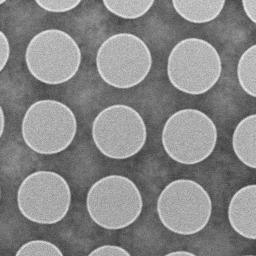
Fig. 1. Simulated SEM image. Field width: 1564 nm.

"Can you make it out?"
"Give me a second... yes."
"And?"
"an array of small figures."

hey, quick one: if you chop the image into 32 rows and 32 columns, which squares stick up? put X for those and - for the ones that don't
-----XXXXX---XXXXXX---XXXXXX--XX
--------------XXXX----XXXXX----X
------------------------XX------
--------------------------------
X----XXXX-----XXX---------------
X---XXXXX----XXXXX----XXXX------
X--XXXXXXX--XXXXXXX---XXXXX----X
X--XXXXXXX--XXXXXXX--XXXXXX---XX
----XXXXXX--XXXXXXX--XXXXXXX--XX
----XXXXX----XXXXX---XXXXXX---XX
--------------XXX-----XXXXX---XX
-----------------------XX------X
--------------------------------
----XXXX------XX----------------
---XXXXXX---XXXXX-----XXXX-----X
---XXXXXX---XXXXXX---XXXXXX---XX
---XXXXXX---XXXXXX--XXXXXXX--XXX
---XXXXXX---XXXXXX--XXXXXXX--XXX
----XXXX----XXXXXX---XXXXXX--XXX
-------------XXX-----XXXXX----XX
-------------------------------X
-----X--------------------------
---XXXXX-----XXX----------------
--XXXXXXX--XXXXXX----XXXX-----XX
--XXXXXXX--XXXXXXX--XXXXXX---XXX
--XXXXXXX--XXXXXXX--XXXXXX---XXX
---XXXXX---XXXXXX---XXXXXX---XXX
----XXX-----XXXXX---XXXXXX---XXX
-------------XX------XXXX----XXX
------------------------------XX
---XXX--------------------------
--XXXXXX----XXXX------X---------